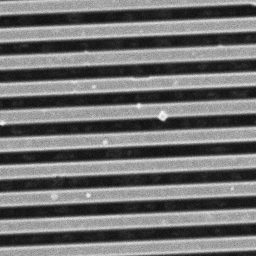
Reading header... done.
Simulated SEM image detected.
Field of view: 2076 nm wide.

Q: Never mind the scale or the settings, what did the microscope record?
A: parallel lines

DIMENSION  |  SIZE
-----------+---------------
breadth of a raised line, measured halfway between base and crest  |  120 nanometers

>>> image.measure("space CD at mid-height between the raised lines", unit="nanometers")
105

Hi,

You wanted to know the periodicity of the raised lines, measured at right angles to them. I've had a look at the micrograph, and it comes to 222 nm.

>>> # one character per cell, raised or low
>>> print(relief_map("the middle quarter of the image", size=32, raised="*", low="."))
***.............................
................................
................................
.............*******************
********************************
********************************
************************........
**..............................
................................
................................
............********************
********************************
********************************
******************......**......
................................
................................
.............................***
......**************************
********************************
********************************
*****************...............
................................
................................
............................****
.....***************************
********************************
********************************
****************................
................................
................................
......................**********
********************************